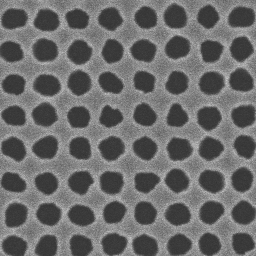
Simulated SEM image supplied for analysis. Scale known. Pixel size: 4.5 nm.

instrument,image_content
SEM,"a regular array of holes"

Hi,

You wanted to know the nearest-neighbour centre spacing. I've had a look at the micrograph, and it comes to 31.2 px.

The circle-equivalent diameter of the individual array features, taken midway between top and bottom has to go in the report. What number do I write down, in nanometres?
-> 104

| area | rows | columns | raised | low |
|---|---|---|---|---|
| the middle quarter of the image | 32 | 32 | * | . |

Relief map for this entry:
********************************
********************************
**....***...******....*****...**
*......**.....***......***.....*
*......**.....***......***.....*
*.....***......***.....**......*
**....****.....****...****.....*
**...**********************..***
********************************
********************************
***..*****.*******...******..***
*.....****....****....****....**
*......**......**......***.....*
*......**......**......**......*
*.....***.....****.....***.....*
**....****...*******..****....**
********************************
********************************
***..******...*****...*****.****
**....***......**......***.....*
*.....***......**......***......
*......**......**......***......
**....***.....****.....***......
***...****...******...*****....*
********************************
********************************
***************************..***
**....***.....****.....***....**
*......**......**.......*......*
*......**......***......*......*
*.....***.....****.....***.....*
**....****....****....*****..***